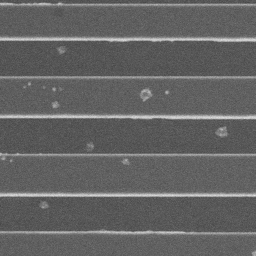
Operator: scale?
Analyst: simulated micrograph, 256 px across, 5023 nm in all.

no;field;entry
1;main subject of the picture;lines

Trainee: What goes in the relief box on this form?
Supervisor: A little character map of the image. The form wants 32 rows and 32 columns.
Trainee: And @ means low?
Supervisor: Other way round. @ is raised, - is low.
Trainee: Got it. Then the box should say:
@@--@@@@------------------------
@@@@@@@@@@@@@@@@@@@@@@@@@@@@@@@@
@@@@@@@@@@@@@@@@@@@@@@@@@@@@@@@@
@@@@@@@@@@@@@@@@@@@@@@@@@@@@@@@@
@@@@@@@@@@@@@@@@@@@@@@@@@@@@@@@@
--------------------------------
--------------------------------
--------------------------------
--------------------------------
--------------------------------
@@@@@@@@@@@@@@@@@@@@@@@@@@@@@@@@
@@@@@@@@@@@@@@@@@@@@@@@@@@@@@@@@
@@@@@@@@@@@@@@@@@@@@@@@@@@@@@@@@
@@@@@@@@@@@@@@@@@@@@@@@@@@@@@@@@
@@@@@@@@@@@@@@@@@@@@@@@@@@@@@@@@
--------------------------------
--------------------------------
--------------------------------
--------------------------------
@@@@@@@@@@@@@@@@@@@@@@@@@@@@@@@@
@@@@@@@@@@@@@@@@@@@@@@@@@@@@@@@@
@@@@@@@@@@@@@@@@@@@@@@@@@@@@@@@@
@@@@@@@@@@@@@@@@@@@@@@@@@@@@@@@@
@@@@@@@@@@@@@@@@@@@@@@@@@@@@@@@@
--------------------------------
--------------------------------
--------------------------------
--------------------------------
--------------------------------
@@@@@@@@@@@@@@@@@@@@@@@@@@@@@@@@
@@@@@@@@@@@@@@@@@@@@@@@@@@@@@@@@
@@@@@@@@@@@@@@@@@@@@@@@@@@@@@@@@